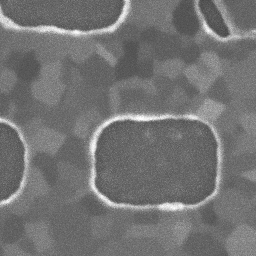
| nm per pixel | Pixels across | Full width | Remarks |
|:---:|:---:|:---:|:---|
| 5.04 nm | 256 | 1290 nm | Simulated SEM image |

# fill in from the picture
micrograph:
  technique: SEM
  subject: holes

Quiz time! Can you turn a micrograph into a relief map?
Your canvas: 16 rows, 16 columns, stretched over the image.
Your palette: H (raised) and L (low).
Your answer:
LLLLLLLLHHHHLLHH
HLLLLLLHHHHHHLHH
HHHHHHHHHHHHHHHH
HHHHHHHHHHHHHHHH
HHHHHHHHHHHHHHHH
HHHHHHHHHHHHHHHH
HHHHHHHHHHHHHHHH
HHHHHHHLLLLLHHHH
LHHHHHLLLLLLLHHH
LLHHHHLLLLLLLLHH
LLHHHHLLLLLLLLHH
LHHHHHLLLLLLLLHH
HHHHHHHLLLLLLHHH
HHHHHHHHHHHHHHHH
HHHHHHHHHHHHHHHH
HHHHHHHHHHHHHHHH